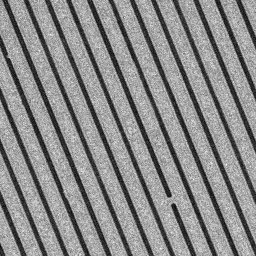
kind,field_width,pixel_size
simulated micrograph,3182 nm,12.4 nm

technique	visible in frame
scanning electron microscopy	parallel lines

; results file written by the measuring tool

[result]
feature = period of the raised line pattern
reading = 244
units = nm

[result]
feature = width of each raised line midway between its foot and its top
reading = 173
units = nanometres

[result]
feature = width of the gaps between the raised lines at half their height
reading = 74.8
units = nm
